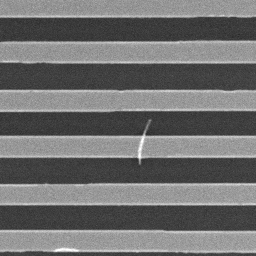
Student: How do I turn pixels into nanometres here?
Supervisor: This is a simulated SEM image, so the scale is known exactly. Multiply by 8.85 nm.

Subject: lines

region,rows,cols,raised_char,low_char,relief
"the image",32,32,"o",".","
oooooooooooooooooooooooooooooooo
oooooooooooooooooooooooooooooooo
................................
................................
................................
oooooooooooooooooooooooooooooooo
oooooooooooooooooooooooooooooooo
oooooooooooooooooooooooooooooooo
................................
................................
................................
oooooooooooooooooooooooooooooooo
oooooooooooooooooooooooooooooooo
oooooooooooooooooooooooooooooooo
................................
................................
................................
oooooooooooooooooooooooooooooooo
oooooooooooooooooooooooooooooooo
oooooooooooooooooooooooooooooooo
................................
................................
................................
oooooooooooooooooooooooooooooooo
oooooooooooooooooooooooooooooooo
ooooooo.oooooo..oooooooooooooooo
................................
................................
................................
oooooooooooooooooooooooooooooooo
oooooooooooooooooooooooooooooooo
..............................oo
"